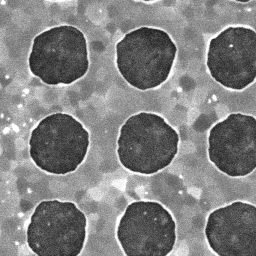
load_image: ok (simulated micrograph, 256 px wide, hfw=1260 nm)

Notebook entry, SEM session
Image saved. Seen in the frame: holes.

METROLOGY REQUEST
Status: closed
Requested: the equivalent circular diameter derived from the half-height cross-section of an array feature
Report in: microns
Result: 0.298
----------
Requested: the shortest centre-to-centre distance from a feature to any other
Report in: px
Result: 86.3